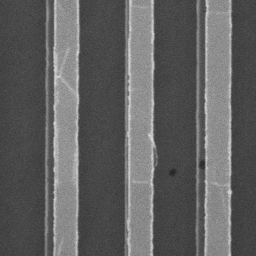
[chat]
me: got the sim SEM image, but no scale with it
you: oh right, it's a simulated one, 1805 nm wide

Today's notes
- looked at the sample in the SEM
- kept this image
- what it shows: lines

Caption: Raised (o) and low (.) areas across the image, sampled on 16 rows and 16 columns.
...oo...oo..oo..
...oo...oo..oo..
...oo...oo..oo..
...oo...oo..oo..
...oo...oo..oo..
...oo...oo..oo..
...oo...oo..oo..
...oo...oo..oo..
...oo...oo..oo..
...oo...oo..oo..
...oo...oo..oo..
...oo...oo..oo..
...oo...oo..oo..
...oo...oo..oo..
...oo...oo..oo..
...oo...oo..oo..